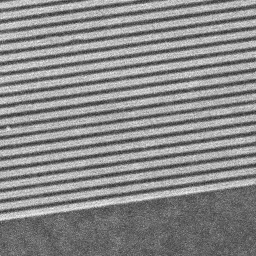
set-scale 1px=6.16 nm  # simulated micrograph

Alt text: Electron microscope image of parallel lines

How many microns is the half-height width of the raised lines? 0.0335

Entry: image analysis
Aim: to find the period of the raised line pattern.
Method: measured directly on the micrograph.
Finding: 0.0646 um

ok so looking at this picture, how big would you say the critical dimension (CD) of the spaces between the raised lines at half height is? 0.0335 um